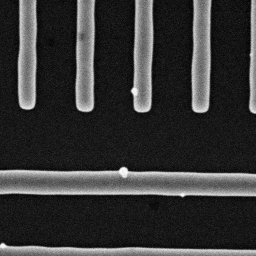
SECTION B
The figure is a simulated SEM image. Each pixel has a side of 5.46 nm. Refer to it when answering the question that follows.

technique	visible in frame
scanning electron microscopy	groups of lines, slits or small figures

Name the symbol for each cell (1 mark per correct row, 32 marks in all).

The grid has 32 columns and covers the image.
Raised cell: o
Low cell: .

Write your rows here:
..ooo.....oo.....oo.....oo.....o
...o......oo.....oo.....oo.....o
...oo.....oo.....oo.....oo.....o
...oo.....oo.....oo.....oo.....o
...oo.....oo.....oo.....oo.....o
...o......oo.....oo.....oo.....o
..oo......oo.....oo.....oo.....o
..ooo.....oo.....oo.....oo.....o
..ooo.....oo.....oo.....oo.....o
..oo......oo.....oo.....oo.....o
..oo......oo.....oo.....oo.....o
..oo......oo.....oo.....oo.....o
..oo......oo.....oo.....oo.....o
...o......oo.....oo.....oo.....o
................................
................................
................................
................................
................................
................................
................................
ooooooo..oo.oooo................
oooooooooooooooooooooooooooooooo
oooooooooooooooooooooooooooooooo
................................
................................
................................
................................
................................
................................
................................
oooooooooooooooooooooooooooooooo